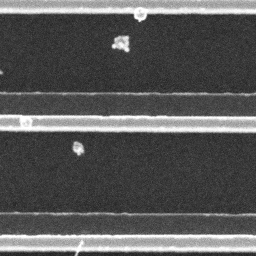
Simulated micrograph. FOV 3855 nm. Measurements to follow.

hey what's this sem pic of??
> lines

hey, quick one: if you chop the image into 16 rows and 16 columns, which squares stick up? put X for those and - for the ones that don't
XXXXXXXXXXXXXXXX
----------------
----------------
----------------
----------------
----------------
XXXXXXXXXXXXXXXX
XXXXXXXXXXXXXXXX
----------------
----------------
----------------
----------------
----------------
XXXXXXXXXXXXXXXX
XXXXXXXXXXXXXXXX
XXXXXXXXXXXXXXXX